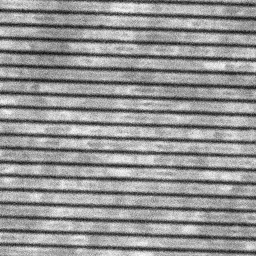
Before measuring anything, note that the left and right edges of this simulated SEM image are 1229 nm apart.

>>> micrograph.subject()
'parallel lines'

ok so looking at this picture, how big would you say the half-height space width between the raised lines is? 16.8 nanometres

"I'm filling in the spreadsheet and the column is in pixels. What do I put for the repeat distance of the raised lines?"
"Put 13.8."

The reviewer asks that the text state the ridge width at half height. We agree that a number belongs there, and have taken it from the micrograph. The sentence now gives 0.0492 µm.